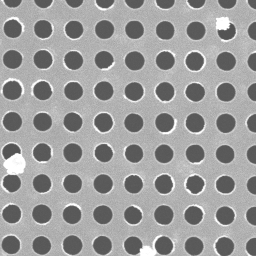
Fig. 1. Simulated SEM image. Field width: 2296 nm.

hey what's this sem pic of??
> a regular array of holes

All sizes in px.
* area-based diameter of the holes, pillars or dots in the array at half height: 18.8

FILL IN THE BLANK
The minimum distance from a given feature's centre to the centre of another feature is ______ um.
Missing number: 0.271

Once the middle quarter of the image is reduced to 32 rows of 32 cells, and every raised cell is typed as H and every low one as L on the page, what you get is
HLLLHHHHLLLLHHHHLLLLHHHHLLLHHHHL
HHLHHHHHHHHHHHHHHLLHHHHHHLHHHHHH
HHHHHHHHHHHHHHHHHHHHHHHHHHHHHHHH
HHHHHHHHHHHHHHHHHHHHHHHHHHHHHHHH
HHLHHHHHHLLHHHHHHLHHHHHHHHHHHHHH
LLLLHHHHLLLLHHHHLLLHHHHLLLLHHHHL
LLLLLHHLLLLLHHHLLLLLHHHLLLLLHHLL
LLLLLHHHLLLLHHHLLLLLHHHLLLLLHHLL
HLLLHHHHLLLLHHHHLLLHHHHHLLLHHHHL
HHHHHHHHHHHHHHHHHHHHHHHHHHHHHHHH
HHHHHHHHHHHHHHHHHHHHHHHHHHHHHHHH
HHHHHHHHHHHHHHHHHHHHHHHHHHHHHHHH
HLLHHHHHHLLHHHHHLLHHHHHHLLHHHHHH
LLLLHHHHLLLLHHHLLLLHHHHLLLLHHHHL
LLLLLHHLLLLLHHHLLLLLHHHLLLLLHHLL
LLLLHHHHLLLLHHHLLLLLHHHLLLLHHHLL
HLLLHHHHHLLHHHHHLLLHHHHHLLLHHHHL
HHHHHHHHHHHHHHHHHHHHHHHHHHHHHHHH
HHHHHHHHHHHHHHHHHHHHHHHHHHHHHHHH
HHHHHHHHHHHHHHHHHHHHHHHHHHHHHHHH
LLLLHHHHLLLHHHHHLLLHHHHHLLHHHHHL
LLLLLHHHLLLLHHHLLLLLHHHLLLLHHHHL
LLLLLHHHLLLLHHHLLLLLHHHLLLLHHHLL
LLLLHHHHLLLLHHHLLLLLHHHLLLLHHHHL
HLLHHHHHHLLHHHHHHLLHHHHHLLHHHHHH
HHHHHHHHHHHHHHHHHHHHHHHHHHHHHHHH
HHHHHHHHHHHHHHHHHHHHHHHHHHHHHHHH
HHLHHHHHHHHHHHHHHHHHHHHHHHHHHHHH
LLLLHHHHLLLLHHHHLLLHHHHLLLLHHHHL
LLLLHHHLLLLLHHHLLLLLHHHLLLLHHHHL
LLLLHHHLLLLLHHHLLLLLHHHLLLLHHHHL
LLLLHHHHLLLLHHHHLLLHHHHLLLLHHHHL